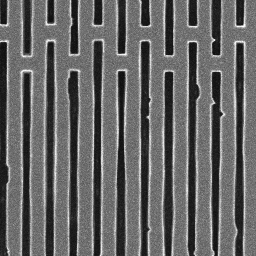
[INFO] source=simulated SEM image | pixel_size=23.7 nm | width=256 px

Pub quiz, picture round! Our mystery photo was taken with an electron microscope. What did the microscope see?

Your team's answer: parallel lines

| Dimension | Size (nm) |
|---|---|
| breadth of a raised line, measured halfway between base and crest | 373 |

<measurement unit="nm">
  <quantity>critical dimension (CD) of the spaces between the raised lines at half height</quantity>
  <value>186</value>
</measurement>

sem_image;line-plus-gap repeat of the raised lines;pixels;23.7